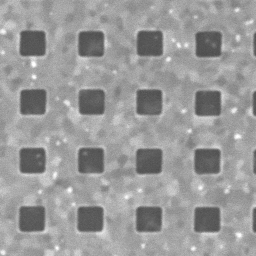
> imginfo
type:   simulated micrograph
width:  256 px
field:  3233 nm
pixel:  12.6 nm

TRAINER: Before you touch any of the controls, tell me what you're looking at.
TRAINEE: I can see a regular array of holes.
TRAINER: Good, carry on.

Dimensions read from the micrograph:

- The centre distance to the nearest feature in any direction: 733 nanometers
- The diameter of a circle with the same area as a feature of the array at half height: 378 nanometres